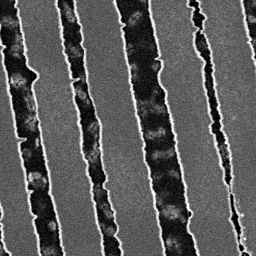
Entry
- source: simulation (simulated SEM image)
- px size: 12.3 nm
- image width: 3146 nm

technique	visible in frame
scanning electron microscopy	one or a few lines or trenches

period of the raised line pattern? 0.781 microns